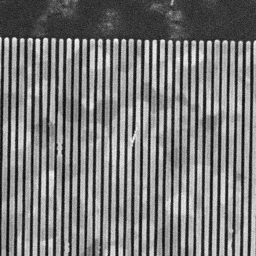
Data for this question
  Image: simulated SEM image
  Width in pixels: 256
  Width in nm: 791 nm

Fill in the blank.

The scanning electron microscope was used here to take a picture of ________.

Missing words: parallel lines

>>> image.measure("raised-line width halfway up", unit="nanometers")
13.1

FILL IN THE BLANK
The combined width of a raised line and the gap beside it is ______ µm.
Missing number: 0.0241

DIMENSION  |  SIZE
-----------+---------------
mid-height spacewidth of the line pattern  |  10.8 nanometres